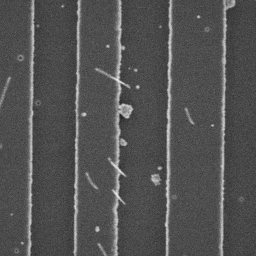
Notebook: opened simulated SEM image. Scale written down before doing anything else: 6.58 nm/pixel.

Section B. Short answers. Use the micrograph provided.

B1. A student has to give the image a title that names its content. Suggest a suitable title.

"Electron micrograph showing lines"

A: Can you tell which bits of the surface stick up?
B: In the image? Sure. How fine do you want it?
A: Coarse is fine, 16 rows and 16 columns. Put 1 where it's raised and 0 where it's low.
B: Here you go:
1100011100011100
1100011100011100
1100011100011100
1100011100011100
1100011000011100
1100011000011100
1100011100011100
1100011100011100
1100011000111100
1100011000111100
1100011000111100
1100011000111100
1100011000111100
1100011000111100
1100011000111100
1100011000111100